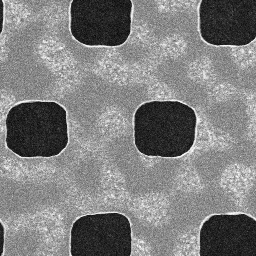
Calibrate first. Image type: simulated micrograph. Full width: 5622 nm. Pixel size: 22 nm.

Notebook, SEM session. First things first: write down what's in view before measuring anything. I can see holes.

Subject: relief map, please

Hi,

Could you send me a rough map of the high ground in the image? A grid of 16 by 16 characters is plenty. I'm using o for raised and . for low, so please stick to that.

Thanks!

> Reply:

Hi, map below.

oooo....oooo....
oooo....oooo....
ooooo...ooooo...
oooooooooooooooo
oooooooooooooooo
oooooooooooooooo
o...ooooo...oooo
....oooo....oooo
....oooo....oooo
o...ooooo...oooo
oooooooooooooooo
oooooooooooooooo
oooooooooooooooo
ooooo...ooooo..o
oooo....ooooo...
oooo....oooo....